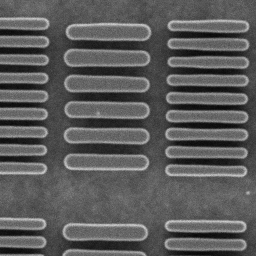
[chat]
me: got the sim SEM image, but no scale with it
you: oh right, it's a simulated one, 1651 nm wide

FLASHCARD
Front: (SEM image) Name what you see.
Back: groups of lines, slits or small figures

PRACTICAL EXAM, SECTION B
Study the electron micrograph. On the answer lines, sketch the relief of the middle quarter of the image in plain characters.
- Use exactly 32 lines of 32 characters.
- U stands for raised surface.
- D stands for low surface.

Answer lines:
DDDDDDDDDDDDDDDDDDDDDDDDDDDUUUUU
DDDDDDDDDDDDDDDDDDDDDDDDDDDDDDDD
DDDDDDDDDDDDDDDDDDDDDDDDDDDDDDDD
DUUUUUUUUUUUUUUUUUDDDDDDDDUUUUUU
UUUUUUUUUUUUUUUUUUUUUDDDDDUUUUUU
UUUUUUUUUUUUUUUUUUUUUDDDDDDDDDDD
DUUUUUUUUUUUUUUUUUUUUDDDDDDDDDDD
DDDDDDDDDDDDDDDDDDDDDDDDDDUUUUUU
DDDDDDDDDDDDDDDDDDDDDDDDDDUUUUUU
DDDDDDDDDDDDDDDDDDDDDDDDDDUUUUUU
UUUUUUUUUUUUUUUUUUUUUDDDDDDDDDDD
UUUUUUUUUUUUUUUUUUUUUDDDDDDDDDDD
DUUUUUUUUUUUUUUUUUUUUDDDDDUUUUUU
DDDDDDDDDDDUUUUUUUUUDDDDDDUUUUUU
DDDDDDDDDDDDDDDDDDDDDDDDDDDDDDDD
DDDDDDDDDDDDDDDDDDDDDDDDDDDDDDDD
DUUUUUUUUUUUUUUUUUUUDDDDDDUUUUUU
UUUUUUUUUUUUUUUUUUUUUDDDDDUUUUUU
UUUUUUUUUUUUUUUUUUUUUDDDDDUUUUUU
DUUUUUUUUUUUUUUUUUUUUDDDDDDDDDDD
DDDDDDDDDDDDDDDDDDDDDDDDDDDDDDDD
DDDDDDDDDDDDDDDDDDDDDDDDDDUUUUUU
DDDDDDDDDDDDDDDDDDDDDDDDDDUUUUUU
UUUUUUUUUUUUUUUUUUUUUDDDDDDDDDDD
UUUUUUUUUUUUUUUUUUUUUDDDDDDDDDDD
UUUUUUUUUUUUUUUUUUUUUDDDDDUUUUUU
DDDDDDDDDDDDDDDDDDDDDDDDDDUUUUUU
DDDDDDDDDDDDDDDDDDDDDDDDDDUUUUUU
DDDDDDDDDDDDDDDDDDDDDDDDDDDDDDDD
DDDDDDDDDDDDDDDDDDDDDDDDDDDDDDDD
DDDDDDDDDDDDDDDDDDDDDDDDDDDDDDDD
DDDDDDDDDDDDDDDDDDDDDDDDDDDDDDDD